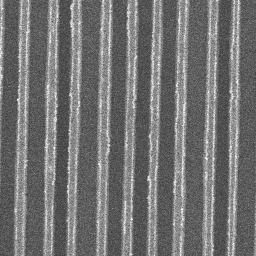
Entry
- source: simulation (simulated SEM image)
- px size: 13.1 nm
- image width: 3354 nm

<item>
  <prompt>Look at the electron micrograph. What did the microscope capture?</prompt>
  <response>parallel lines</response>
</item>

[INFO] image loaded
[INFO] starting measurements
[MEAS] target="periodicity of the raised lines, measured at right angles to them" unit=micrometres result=0.346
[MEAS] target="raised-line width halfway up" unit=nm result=116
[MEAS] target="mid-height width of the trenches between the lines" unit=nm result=219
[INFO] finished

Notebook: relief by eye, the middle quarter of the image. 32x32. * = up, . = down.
..**.....**.....**....**....**..
..**.....**.....**....**....**..
..**.....**.....**....**....**..
..**.....**.....**....**....**..
..**.....***....**....**....**..
..**.....***....**....**....**..
..**.....**.....**....**....**..
.***.....***....**....**....**..
..**.....***....**....**....**..
..**.....**.....**....**....**..
..**.....**.....**....**....**..
..**.....**.....**....**....**..
..**.....**.....**....**....**..
..**.....**.....**....**....**..
..**.....**.....**....**....**..
..*......**.....**....**....**..
.**......**.....**....**....**..
.**......**.....*....***....**..
.**......**....**....***....**..
.**......**....**.....**....**..
.**......**....**.....**....**..
.**......**....**.....**....**..
.**......**....**.....*.....**..
.**......**....**.....*.....**..
.**......**....**.....*.....**..
.**......**....**....**.....**..
.**......**....**....**.....**..
.**......**....**....**.....**..
.**......**....**....**.....**..
.**......**....**....**.....**..
.**......**....**....**.....**..
.**......**....**....**.....**..